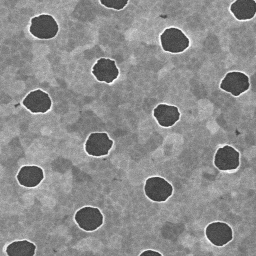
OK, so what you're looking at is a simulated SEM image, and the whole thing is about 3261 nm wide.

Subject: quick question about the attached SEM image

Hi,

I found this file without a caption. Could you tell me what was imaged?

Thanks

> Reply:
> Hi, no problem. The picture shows a regular array of holes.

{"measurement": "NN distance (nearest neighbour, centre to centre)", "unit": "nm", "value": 948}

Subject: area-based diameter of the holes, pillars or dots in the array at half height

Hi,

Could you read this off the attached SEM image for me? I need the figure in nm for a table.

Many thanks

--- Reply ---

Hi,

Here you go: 327